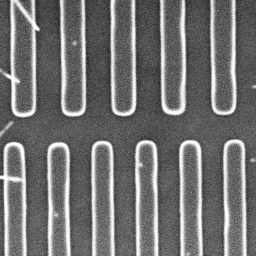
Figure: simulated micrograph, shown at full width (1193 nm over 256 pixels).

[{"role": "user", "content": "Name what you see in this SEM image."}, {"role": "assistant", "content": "groups of lines, slits or small figures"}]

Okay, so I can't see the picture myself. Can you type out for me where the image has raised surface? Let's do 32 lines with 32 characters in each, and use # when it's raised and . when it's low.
.###....##....###...###...###...
.###....###...###...###....##...
.###....###...###...###...###...
..###...###...###...###...###...
..##....###...###...###...###...
..##....###...###...###....##...
.###....###...###...###....##...
.###....###...###...###....##...
.###....###...###...###....##...
.###....###...###...###....##...
..##....###...###...###....##...
..##....###...###...###....##...
..##....###...###...###....##...
..##....###...###....##....##...
................................
................................
................................
................................
.##...##....##...##....##...##..
.##...##....##...##....##...##..
.##...##....##...##....##...##..
.##...##....##...##....##...##..
.##...##....##...##....##...###.
.##...##....##...##....##...###.
.##...##....##...###...##...###.
.##...##....##...###...##...###.
.##...##....##...###...##...###.
.##...##....##...##....##...###.
.##...##....##...##....##...###.
.##...##....##...###...##...###.
.##...###...##...###...##...###.
.##...###...##...###...##...###.